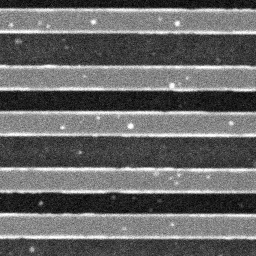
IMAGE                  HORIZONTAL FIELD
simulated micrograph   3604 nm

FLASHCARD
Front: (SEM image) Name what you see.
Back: lines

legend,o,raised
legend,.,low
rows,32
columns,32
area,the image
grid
................................
oooooooooooooooooooooooooooooooo
oooooooooooooooooooooooooooooooo
oooooooooooooooooooooooooooooooo
................................
................................
................................
................................
oooooooooooooooooooooooooooooooo
oooooooooooooooooooooooooooooooo
oooooooooooooooooooooooooooooooo
................................
................................
................................
oooooooooooooooooooooooooooooooo
oooooooooooooooooooooooooooooooo
oooooooooooooooooooooooooooooooo
................................
................................
................................
................................
oooooooooooooooooooooooooooooooo
oooooooooooooooooooooooooooooooo
oooooooooooooooooooooooooooooooo
................................
................................
................................
oooooooooooooooooooooooooooooooo
oooooooooooooooooooooooooooooooo
oooooooooooooooooooooooooooooooo
................................
................................